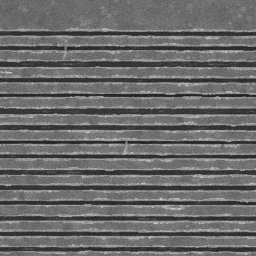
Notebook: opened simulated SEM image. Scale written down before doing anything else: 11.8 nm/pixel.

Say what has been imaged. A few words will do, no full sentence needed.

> parallel lines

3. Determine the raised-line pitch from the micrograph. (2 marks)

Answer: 182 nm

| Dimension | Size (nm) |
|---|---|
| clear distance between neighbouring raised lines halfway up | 60.3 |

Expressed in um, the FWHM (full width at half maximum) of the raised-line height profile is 0.122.